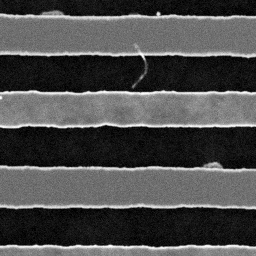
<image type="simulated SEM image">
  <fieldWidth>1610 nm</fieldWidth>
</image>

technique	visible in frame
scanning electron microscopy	lines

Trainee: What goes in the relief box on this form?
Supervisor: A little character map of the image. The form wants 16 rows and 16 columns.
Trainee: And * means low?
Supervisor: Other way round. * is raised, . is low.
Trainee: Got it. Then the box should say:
................
****************
****************
...............*
................
................
****************
****************
................
................
*******..**.....
****************
****************
................
................
****************